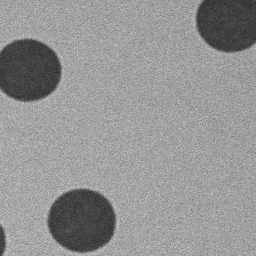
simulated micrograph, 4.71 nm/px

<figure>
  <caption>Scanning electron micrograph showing holes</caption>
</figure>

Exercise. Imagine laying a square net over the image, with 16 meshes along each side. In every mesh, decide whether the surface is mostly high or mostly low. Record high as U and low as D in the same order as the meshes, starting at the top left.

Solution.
UUUUUUUUUUUUDDDD
UUUUUUUUUUUUDDDD
UDUUUUUUUUUUUDDD
DDDDUUUUUUUUUUUU
DDDDUUUUUUUUUUUU
DDDUUUUUUUUUUUUU
UUUUUUUUUUUUUUUU
UUUUUUUUUUUUUUUU
UUUUUUUUUUUUUUUU
UUUUUUUUUUUUUUUU
UUUUUUUUUUUUUUUU
UUUUUUUUUUUUUUUU
UUUUDDDUUUUUUUUU
UUUDDDDUUUUUUUUU
UUUDDDDUUUUUUUUU
UUUUDDUUUUUUUUUU